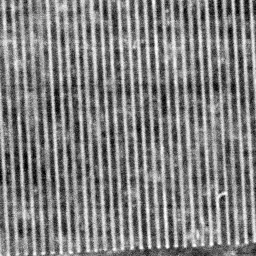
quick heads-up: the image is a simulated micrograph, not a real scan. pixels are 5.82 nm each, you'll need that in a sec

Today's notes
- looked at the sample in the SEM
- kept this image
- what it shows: parallel lines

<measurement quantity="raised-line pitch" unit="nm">51.3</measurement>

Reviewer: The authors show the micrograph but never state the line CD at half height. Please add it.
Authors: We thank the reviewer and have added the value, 13.8 nanometres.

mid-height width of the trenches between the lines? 37 nanometres